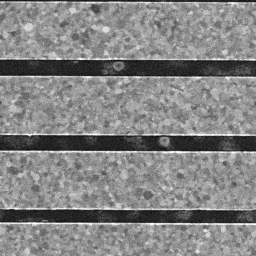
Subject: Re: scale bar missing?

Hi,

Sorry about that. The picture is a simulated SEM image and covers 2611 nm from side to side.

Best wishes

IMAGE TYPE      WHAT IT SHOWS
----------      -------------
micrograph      one or a few lines or trenches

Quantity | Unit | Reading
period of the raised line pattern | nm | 762